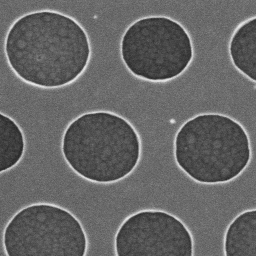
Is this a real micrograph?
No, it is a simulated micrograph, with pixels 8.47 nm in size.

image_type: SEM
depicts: holes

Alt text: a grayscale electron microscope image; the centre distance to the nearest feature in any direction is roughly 932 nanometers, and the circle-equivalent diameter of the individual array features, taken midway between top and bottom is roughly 610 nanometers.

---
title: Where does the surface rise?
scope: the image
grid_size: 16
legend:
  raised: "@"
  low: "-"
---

@@@@@@@@@@@@@@@@
@----@@@---@@@@-
-----@@@----@@@-
------@@----@@--
@----@@@---@@@@-
@@@@@@@@@@@@@@@@
@@@@@@@@@@@@@@@@
-@@@@---@@@@--@@
-@@@-----@@----@
-@@@-----@@-----
-@@@@---@@@----@
@@@@@@@@@@@@@@@@
@@@@@@@@@@@@@@@@
@---@@@@---@@@@-
-----@@-----@@--
-----@@-----@@--